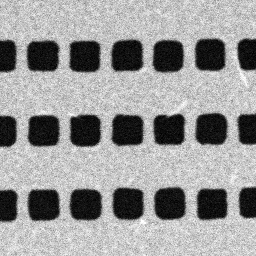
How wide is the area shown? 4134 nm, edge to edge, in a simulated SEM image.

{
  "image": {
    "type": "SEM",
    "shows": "a regular array of holes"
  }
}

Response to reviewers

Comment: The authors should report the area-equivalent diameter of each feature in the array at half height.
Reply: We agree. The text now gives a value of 554 nm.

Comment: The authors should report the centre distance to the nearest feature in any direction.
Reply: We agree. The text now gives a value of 676 nm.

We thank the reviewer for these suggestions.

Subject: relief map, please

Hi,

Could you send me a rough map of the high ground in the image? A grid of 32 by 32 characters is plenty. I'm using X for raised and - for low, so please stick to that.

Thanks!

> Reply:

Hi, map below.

XXXXXXXXXXXXXXXXXXXXXXXXXXXXXXXX
XXXXXXXXXXXXXXXXXXXXXXXXXXXXXXXX
XXXXXXXXXXXXXXXXXXXXXXXXXXXXXXXX
XXXXXXXXXXXXXXXXXXXXXXXXXXXXXXXX
XXXXXXXXXXXXXXXXXXXXXXXXXXXXXXXX
--XX---XX---XX----X----XX---XX--
--X----XX----X----X----X----XX--
--X----XX----X----X----X----XX--
--XX---XX---XX----X----XX---XX--
XXXXXXXXXXXXXXXXXXXXXXXXXXXXXXXX
XXXXXXXXXXXXXXXXXXXXXXXXXXXXXXXX
XXXXXXXXXXXXXXXXXXXXXXXXXXXXXXXX
XXXXXXXXXXXXXXXXXXXXXXXXXXXXXXXX
XXXXXXXXXXXXXXXXXXXXXXXXXXXXXXXX
-XXX---XXX--XX---XXX---XX---XX--
--X----XX----X----X----X----XX--
--X----XX----X----X----X----XX--
--XX---XX---XX----X----XX---XX--
XXXXXXXXXXXXXXXXXXXXXXXXXXXXXXXX
XXXXXXXXXXXXXXXXXXXXXXXXXXXXXXXX
XXXXXXXXXXXXXXXXXXXXXXXXXXXXXXXX
XXXXXXXXXXXXXXXXXXXXXXXXXXXXXXXX
XXXXXXXXXXXXXXXXXXXXXXXXXXXXXXXX
XXXXXXXXXXXXXXX--XXXX-XXXXXXXX--
--XX---XX----X----X----XX---XX--
--X----XX----X----X----XX---XX--
--XX---XX----X----X----XX---XX--
--XX---XXX--XXXX-XXXX-XXXXXXXXXX
XXXXXXXXXXXXXXXXXXXXXXXXXXXXXXXX
XXXXXXXXXXXXXXXXXXXXXXXXXXXXXXXX
XXXXXXXXXXXXXXXXXXXXXXXXXXXXXXXX
XXXXXXXXXXXXXXXXXXXXXXXXXXXXXXXX